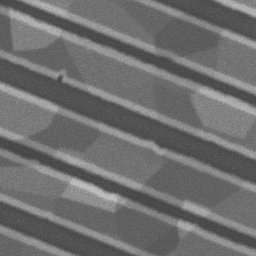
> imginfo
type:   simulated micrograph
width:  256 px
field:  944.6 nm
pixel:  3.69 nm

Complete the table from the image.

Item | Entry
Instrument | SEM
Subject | one or a few lines or trenches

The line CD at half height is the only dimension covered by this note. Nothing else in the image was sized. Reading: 156 nanometres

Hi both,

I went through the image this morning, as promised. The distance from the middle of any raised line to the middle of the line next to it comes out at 246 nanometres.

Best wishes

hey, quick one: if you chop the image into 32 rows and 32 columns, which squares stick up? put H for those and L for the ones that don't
LLLLLHHHHHHHHHHHHHHLLLLLLLLLLHHH
HLLLLLLHHHHHHHHHHHHHHHLLLLLLLLLL
HHHHLLLLLLHHHHHHHHHHHHHHLLLLLLLL
HHHHHHLLLLLLHHHHHHHHHHHHHHLLLLLL
HHHHHHHHLLLLLLLHHHHHHHHHHHHHHLLL
HHHHHHHHHHHLLLLLLHHHHHHHHHHHHHHL
HHHHHHHHHHHHHHLLLLLLHHHHHHHHHHHH
LLHHHHHHHHHHHHHHLLLLLLHHHHHHHHHH
LLLLHHHHHHHHHHHHHHHLLLLLLHHHHHHH
LLLLLLLLHHHHHHHHHHHHHLLLLLLHHHHH
LLLLLLLLLLHHHHHHHHHHHHHLLLLLLLHH
HHLLLLLLLLLLHHHHHHHHHHHHHHLLLLLL
HHHHLLLLLLLLLLLHHHHHHHHHHHHHLLLL
HHHHHHHLLLLLLLLLLHHHHHHHHHHHHHHL
HHHHHHHHHLLLLLLLLLLLHHHHHHHHHHHH
HHHHHHHHHHHHLLLLLLLLLLHHHHHHHHHH
HHHHHHHHHHHHHHLLLLLLLLLLHHHHHHHH
LLLHHHHHHHHHHHHHHLLLLLLLLLLHHHHH
LLLLLHHHHHHHHHHHHHHLLLLLLLLLLLHH
HLLLLLLLHHHHHHHHHHHHHHLLLLLLLLLL
HHHHLLLLLLHHHHHHHHHHHHHHLLLLLLLL
HHHHHHLLLLLLLHHHHHHHHHHHHHHLLLLL
HHHHHHHHHLLLLLLHHHHHHHHHHHHHHLLL
HHHHHHHHHHHLLLLLLLHHHHHHHHHHHHHH
HHHHHHHHHHHHHLLLLLLLHHHHHHHHHHHH
LLHHHHHHHHHHHHHHLLLLLLLHHHHHHHHH
LLLLLHHHHHHHHHHHHHHLLLLLLHHHHHHH
LLLLLLLHHHHHHHHHHHHHHLLLLLLLHHHH
LLLLLLLLLLHHHHHHHHHHHHHHLLLLLLHH
HHLLLLLLLLLLHHHHHHHHHHHHHHLLLLLL
HHHHHLLLLLLLLLLHHHHHHHHHHHHHHLLL
HHHHHHHLLLLLLLLLLHHHHHHHHHHHHHHL